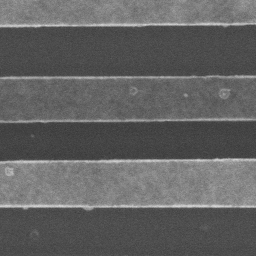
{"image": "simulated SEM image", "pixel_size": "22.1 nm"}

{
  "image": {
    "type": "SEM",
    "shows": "lines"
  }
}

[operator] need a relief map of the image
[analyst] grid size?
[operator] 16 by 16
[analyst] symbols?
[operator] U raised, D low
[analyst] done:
UUUUUUUUUUUUUUUU
UUUUUUUUUUUUUUUD
DDDDDDDDDDDDDDDD
DDDDDDDDDDDDDDDD
DDDDDDDDDDDDDDDD
UUUUUUUUUUUUUUUU
UUUUUUUUUUUUUUUU
UUUUUUUUUUUUUUUU
DDDDDDDDDDDDDDDD
DDDDDDDDDDDDDDDD
UUUUUUUUUUUUUUUU
UUUUUUUUUUUUUUUU
UUUUUUUUUUUUUUUU
DDDDDDDDDDDDDDDD
DDDDDDDDDDDDDDDD
DDDDDDDDDDDDDDDD